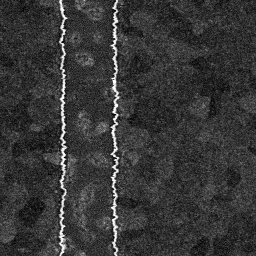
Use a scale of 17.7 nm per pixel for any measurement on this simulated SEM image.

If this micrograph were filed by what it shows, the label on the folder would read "one or a few lines or trenches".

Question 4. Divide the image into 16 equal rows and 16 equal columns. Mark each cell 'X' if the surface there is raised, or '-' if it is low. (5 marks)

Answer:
XXXX---XXXXXXXXX
XXXX---XXXXXXXXX
XXXX---XXXXXXXXX
XXXX---XXXXXXXXX
XXXX---XXXXXXXXX
XXXX---XXXXXXXXX
XXXX---XXXXXXXXX
XXXX---XXXXXXXXX
XXXX---XXXXXXXXX
XXXX---XXXXXXXXX
XXXX---XXXXXXXXX
XXXX---XXXXXXXXX
XXXX---XXXXXXXXX
XXXX---XXXXXXXXX
XXXX---XXXXXXXXX
XXXX---XXXXXXXXX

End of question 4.